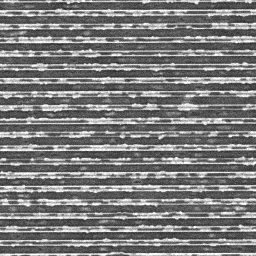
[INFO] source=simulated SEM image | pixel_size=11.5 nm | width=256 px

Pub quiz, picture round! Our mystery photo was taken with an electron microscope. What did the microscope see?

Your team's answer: parallel lines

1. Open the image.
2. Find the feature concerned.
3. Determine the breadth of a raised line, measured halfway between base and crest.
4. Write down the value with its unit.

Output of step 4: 60.5 nanometres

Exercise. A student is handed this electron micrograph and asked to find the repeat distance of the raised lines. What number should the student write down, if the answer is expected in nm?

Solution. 156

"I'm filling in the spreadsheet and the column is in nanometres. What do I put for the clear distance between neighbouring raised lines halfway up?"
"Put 102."